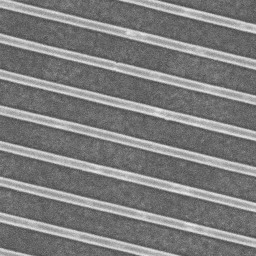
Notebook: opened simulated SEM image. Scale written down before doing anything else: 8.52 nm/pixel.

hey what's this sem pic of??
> parallel lines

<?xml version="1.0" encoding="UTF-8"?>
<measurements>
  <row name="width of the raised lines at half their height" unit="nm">66.2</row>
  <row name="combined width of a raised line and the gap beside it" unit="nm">295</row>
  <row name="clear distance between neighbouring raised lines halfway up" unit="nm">224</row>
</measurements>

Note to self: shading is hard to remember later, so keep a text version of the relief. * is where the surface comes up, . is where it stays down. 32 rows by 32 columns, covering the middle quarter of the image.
.........********...............
.............********...........
................*********.......
....................*********...
........................********
............................****
****............................
.********.......................
.....********...................
.........********...............
.............********...........
.................********.......
.....................********...
.........................*******
*............................***
******..........................
.*********......................
.....*********..................
.........********...............
.............********...........
.................********.......
.....................********...
.........................*******
*.............................**
*****...........................
.********.......................
.....*********..................
.........*********..............
.............*********..........
.................*********......
.....................*********..
..........................******